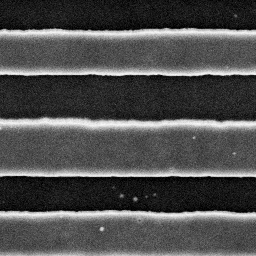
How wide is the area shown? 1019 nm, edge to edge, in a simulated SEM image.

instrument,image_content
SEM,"lines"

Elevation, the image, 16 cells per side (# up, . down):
................
................
################
################
################
................
................
................
################
################
################
................
................
################
################
################